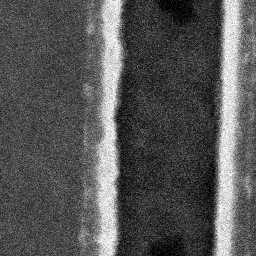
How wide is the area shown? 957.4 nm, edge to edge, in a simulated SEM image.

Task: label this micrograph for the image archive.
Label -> one or a few lines or trenches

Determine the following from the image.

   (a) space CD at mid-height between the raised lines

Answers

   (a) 120 px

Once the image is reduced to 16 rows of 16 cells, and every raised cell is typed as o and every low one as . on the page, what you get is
ooooooo........o
ooooooo........o
ooooooo........o
ooooooo.......oo
ooooooo.......oo
ooooooo.......oo
ooooooo.......oo
ooooooo.......oo
ooooooo.......oo
ooooooo.......oo
ooooooo.......oo
ooooooo.......oo
ooooooo.......oo
ooooooo.......oo
ooooooo.......oo
ooooooo.......oo